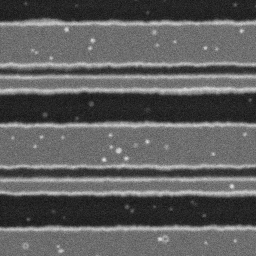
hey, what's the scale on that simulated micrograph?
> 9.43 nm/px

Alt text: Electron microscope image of lines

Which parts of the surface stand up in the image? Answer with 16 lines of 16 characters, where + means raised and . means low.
................
++++++++++++++++
++++++++++++++++
++++++++++++++++
++++++++++++++++
++++++++++++++++
................
................
++++++++++++++++
++++++++++++++++
++++++++++++++++
++++++++++++++++
................
................
++++++++++++++++
++++++++++++++++